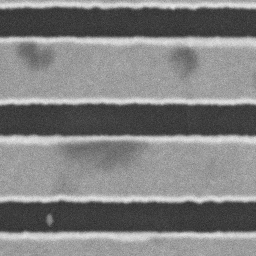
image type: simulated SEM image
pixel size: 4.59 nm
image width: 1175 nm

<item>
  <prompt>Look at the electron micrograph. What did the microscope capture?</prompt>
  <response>lines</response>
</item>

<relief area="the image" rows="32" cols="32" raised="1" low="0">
11111111111111111111111111111111
00000000000000000000000000000000
00000000000000000000000000000000
00000000000000000000000000000000
00000000000000000000000000000000
11111111111111111111111111111111
11111111111111111111111111111111
11111111111111111111111111111111
11111111111111111111111111111111
11111111111111111111111111111111
11111111111111111111111111111111
11111111111111111111111111111111
11111111111111111111111111111111
00000000000000000000000000000000
00000000000000000000000000000000
00000000000000000000000000000000
00000000000000000000000000000000
11111111111111111111111111111111
11111111111111111111111111111111
11111111111111111111111111111111
11111111111111111111111111111111
11111111111111111111111111111111
11111111111111111111111111111111
11111111111111111111111111111111
11111111111111111111111111111111
00000000000000000000000000000000
00000000000000000000000000000000
00000000000000000000000000000000
00000000000000000000000000000000
11111111111111111111111111111111
11111111111111111111111111111111
11111111111111111111111111111111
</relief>